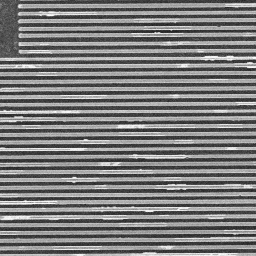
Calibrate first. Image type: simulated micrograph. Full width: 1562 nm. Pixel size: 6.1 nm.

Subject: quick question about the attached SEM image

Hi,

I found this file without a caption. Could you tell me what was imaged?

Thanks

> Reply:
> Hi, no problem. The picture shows parallel lines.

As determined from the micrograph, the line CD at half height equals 0.0236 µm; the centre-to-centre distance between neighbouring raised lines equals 46.1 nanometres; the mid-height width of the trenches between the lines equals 23.6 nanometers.